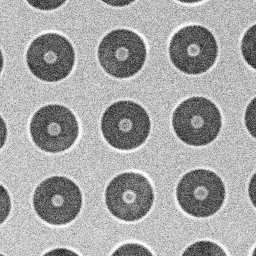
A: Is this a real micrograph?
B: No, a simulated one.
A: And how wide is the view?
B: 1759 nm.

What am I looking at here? an array of small figures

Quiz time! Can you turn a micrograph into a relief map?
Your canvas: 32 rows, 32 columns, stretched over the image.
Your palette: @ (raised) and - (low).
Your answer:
@@@@----@@@@@---@@@@@@@-@@@@@@@@
@@@@@@@@@@@@@@@@@@@@@@@@@@@@@@@@
@@@@@@@@@@@@@@@@@@@@@@@@@@@@@@@@
@@@@@@@@@@@@@@@@@@@@@@----@@@@@-
@@@@@---@@@@@-----@@@------@@@--
@@@@-----@@@------@@@------@@@--
@@@------@@@---@--@@@---@--@@@--
@@@---@--@@@------@@@------@@@@-
@@@@-----@@@@-----@@@@----@@@@@-
@@@@----@@@@@@---@@@@@@@@@@@@@@@
@@@@@@@@@@@@@@@@@@@@@@@@@@@@@@@@
@@@@@@@@@@@@@@@@@@@@@@@@@@@@@@@@
@@@@@@@@@@@@@@@-@@@@@@@---@@@@@-
@@@@@----@@@@-----@@@@-----@@@@-
@@@@-----@@@@------@@-------@@--
-@@@------@@@--@---@@---@---@@@-
-@@@--@---@@@------@@@-----@@@@-
-@@@------@@@-----@@@@@----@@@@@
@@@@@----@@@@@---@@@@@@@@@@@@@@@
@@@@@@@@@@@@@@@@@@@@@@@@@@@@@@@@
@@@@@@@@@@@@@@@@@@@@@@@@@@@@@@@@
@@@@@@@@@@@@@@@@-@@@@@@----@@@@@
@@@@@----@@@@@-----@@@------@@@-
-@@@------@@@------@@@------@@@-
-@@@------@@@---@--@@@---@--@@@-
-@@@---@--@@@------@@@------@@@-
-@@@------@@@@-----@@@@----@@@@@
-@@@@----@@@@@@--@@@@@@@@@@@@@@@
@@@@@@@@@@@@@@@@@@@@@@@@@@@@@@@@
@@@@@@@@@@@@@@@@@@@@@@@@@@@@@@@@
@@@@@@@@@@@@@@@---@@@@@@---@@@@@
@@@@@@---@@@@@-----@@@@-----@@@-